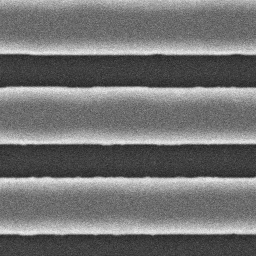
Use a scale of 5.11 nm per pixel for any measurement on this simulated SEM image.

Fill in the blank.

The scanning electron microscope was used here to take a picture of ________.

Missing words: lines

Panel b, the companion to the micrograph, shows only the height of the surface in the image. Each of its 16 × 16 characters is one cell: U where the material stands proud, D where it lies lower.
UUUUUUUUUUUUUUUU
UUUUUUUUUUUUUUUU
UUUUUUUUUUUUUUUU
DDDDDDDDDDDDDDDD
DDDDDDDDDDDDDDDD
DUUUDDDUUUDDDDDD
UUUUUUUUUUUUUUUU
UUUUUUUUUUUUUUUU
UUUUUUUUUUUUUUUU
DDDDDDDDDDDDDDDD
DDDDDDDDDDDDDDDD
UUUUUUUUUUUUUUUU
UUUUUUUUUUUUUUUU
UUUUUUUUUUUUUUUU
UUUUUUUUUUUUUUUU
DDDDDDDDDDDDDDDD